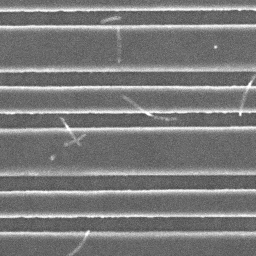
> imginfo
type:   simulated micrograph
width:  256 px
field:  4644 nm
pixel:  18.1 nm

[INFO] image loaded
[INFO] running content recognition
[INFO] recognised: lines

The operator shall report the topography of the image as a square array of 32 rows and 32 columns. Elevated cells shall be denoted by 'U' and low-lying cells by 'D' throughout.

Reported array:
UUUUUUUUUUUUUUUUUUUUUUUUUUUUUUUU
DDDDDDDDDDDDDDDDDDDDDDDDDDDDDDDD
DDDDDDDDDDDDDDDDDDDDDDDDDDDDDDDD
UUUUUUUUUUUUUUUUUUUUUUUUUUUUUUUU
UUUUUUUUUUUUUUUUUUUUUUUUUUUUUUUU
UUUUUUUUUUUUUUUUUUUUUUUUUUUUUUUU
UUUUUUUUUUUUUUUUUUUUUUUUUUUUUUUU
UUUUUUUUUUUUUUUUUUUUUUUUUUUUUUUU
UUUUUUUUUUUUUUUUUUUUUUUUUUUUUUUU
DDDDDDDDDDDDDDDDDDDDDDDDDDDDDDDD
DDDDDDDDDDDDDDDDDDDDDDDDDDDDDDDD
UUUUUUUUUUUUUUUUUUUUUUUUUUUUUUUU
UUUUUUUUUUUUUUUUUUUUUUUUUUUUUUUU
UUUUUUUUUUUUUUUUUUUUUUUUUUUUUUUU
DDDDDDDDDDDDDDDDDDDDDDDDDDDDDDDD
DDDDDDDDDDDDDDDDDDDDDDDDDDDDDDDD
UUUUUUUUUUUUUUUUUUUUUUUUUUUUUUUU
UUUUUUUUUUUUUUUUUUUUUUUUUUUUUUUU
UUUUUUUUUUUUUUUUUUUUUUUUUUUUUUUU
UUUUUUUUUUUUUUUUUUUUUUUUUUUUUUUU
UUUUUUUUUUUUUUUUUUUUUUUUUUUUUUUU
UUUUUUUUUUUUUUUUUUUUUUUUUUUUUUUU
DDDDDDDDDDDDDDDDDDDDDDDDDDDDDDDD
DDDDDDDDDDDDDDDDDDDDDDDDDDDDDDDD
UUUUUUUUUUUUUUUUUUUUUUUUUUUUUUUU
UUUUUUUUUUUUUUUUUUUUUUUUUUUUUUUU
UUUUUUUUUUUUUUUUUUUUUUUUUUUUUUUU
DDDDDDDDDDDDDDDDDDDDDDDDDDDDDDDD
DDDDDDDDDDDDDDDDDDDDDDDDDDDDDDDD
UUUUUUUUUUUUUUUUUUUUUUUUUUUUUUUU
UUUUUUUUUUUUUUUUUUUUUUUUUUUUUUUU
UUUUUUUUUUUUUUUUUUUUUUUUUUUUUUUU